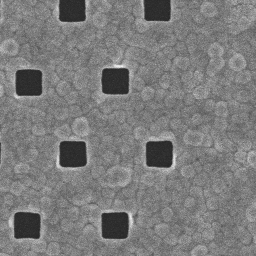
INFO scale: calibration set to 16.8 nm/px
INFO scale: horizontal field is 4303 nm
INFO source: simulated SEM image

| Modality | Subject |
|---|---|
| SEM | holes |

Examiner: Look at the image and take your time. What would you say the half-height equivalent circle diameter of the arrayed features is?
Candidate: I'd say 502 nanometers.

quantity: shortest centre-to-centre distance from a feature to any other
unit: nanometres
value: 1410